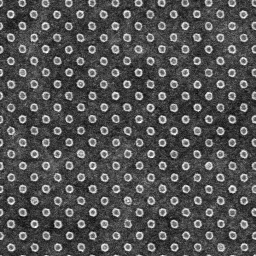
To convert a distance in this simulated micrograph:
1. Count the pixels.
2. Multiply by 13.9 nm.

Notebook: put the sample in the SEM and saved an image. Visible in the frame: a regular array of raised bodies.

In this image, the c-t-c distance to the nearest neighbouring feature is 0.226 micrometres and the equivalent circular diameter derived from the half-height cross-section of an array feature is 0.0993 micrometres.